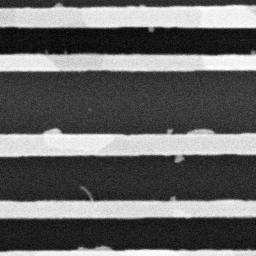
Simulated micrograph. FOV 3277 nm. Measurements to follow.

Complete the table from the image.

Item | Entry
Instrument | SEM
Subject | lines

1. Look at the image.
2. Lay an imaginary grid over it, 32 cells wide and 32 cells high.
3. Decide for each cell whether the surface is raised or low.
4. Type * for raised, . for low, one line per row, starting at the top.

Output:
................................
********************************
********************************
................................
................................
................................
................................
********************************
********************************
................................
................................
................................
................................
................................
................................
................................
................................
********************************
********************************
***.............................
................................
................................
................................
................................
................................
********************************
********************************
................................
................................
................................
................................
.*******************************